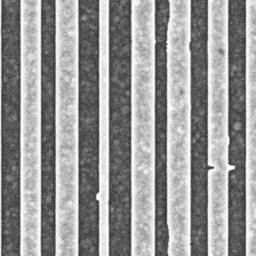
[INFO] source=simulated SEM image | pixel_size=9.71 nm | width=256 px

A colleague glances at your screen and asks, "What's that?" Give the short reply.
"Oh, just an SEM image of parallel lines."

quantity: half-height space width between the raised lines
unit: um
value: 0.177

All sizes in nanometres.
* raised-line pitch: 364